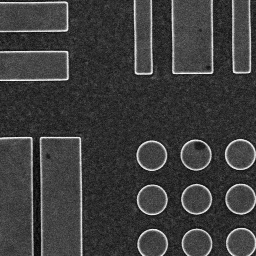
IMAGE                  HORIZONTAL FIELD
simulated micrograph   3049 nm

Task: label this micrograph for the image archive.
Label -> groups of lines, slits or small figures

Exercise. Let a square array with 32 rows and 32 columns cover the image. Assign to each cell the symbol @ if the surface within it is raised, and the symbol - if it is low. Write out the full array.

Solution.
@@@@@@@@---------@@---@@@@@--@@-
@@@@@@@@---------@@---@@@@@--@@-
@@@@@@@@---------@@---@@@@@--@@-
@@@@@@@@---------@@---@@@@@--@@-
-----------------@@---@@@@@--@@-
-----------------@@---@@@@@--@@-
@@@@@@@@---------@@---@@@@@--@@-
@@@@@@@@---------@@---@@@@@--@@-
@@@@@@@@---------@@---@@@@@--@@-
@@@@@@@@------------------------
--------------------------------
--------------------------------
--------------------------------
--------------------------------
--------------------------------
--------------------------------
--------------------------------
@@@@-@@@@@----------------------
@@@@-@@@@@-------@@@@--@@@--@@@@
@@@@-@@@@@-------@@@@--@@@--@@@@
@@@@-@@@@@-------@@@---@@@---@@@
@@@@-@@@@@----------------------
@@@@-@@@@@----------------------
@@@@-@@@@@--------@@---@@@---@@-
@@@@-@@@@@-------@@@@--@@@--@@@@
@@@@-@@@@@-------@@@@--@@@--@@@@
@@@@-@@@@@--------@@----@----@@-
@@@@-@@@@@----------------------
@@@@-@@@@@----------------------
@@@@-@@@@@--------@@@--@@@---@@@
@@@@-@@@@@-------@@@@--@@@--@@@@
@@@@-@@@@@--------@@@--@@@---@@@